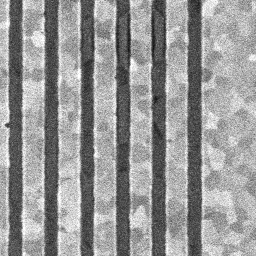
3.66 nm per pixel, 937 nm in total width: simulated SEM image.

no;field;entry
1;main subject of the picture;parallel lines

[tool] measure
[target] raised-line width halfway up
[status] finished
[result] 0.0731 microns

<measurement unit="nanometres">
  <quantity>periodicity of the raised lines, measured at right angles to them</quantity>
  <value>131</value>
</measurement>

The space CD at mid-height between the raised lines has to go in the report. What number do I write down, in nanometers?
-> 55.8